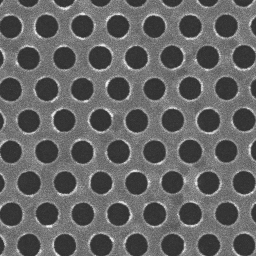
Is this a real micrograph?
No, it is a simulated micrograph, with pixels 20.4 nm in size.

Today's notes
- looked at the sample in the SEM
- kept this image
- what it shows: a regular array of holes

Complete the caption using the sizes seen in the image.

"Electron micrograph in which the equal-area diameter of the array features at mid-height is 474 nm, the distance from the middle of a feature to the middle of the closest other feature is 722 nm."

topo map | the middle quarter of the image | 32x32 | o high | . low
..ooooo....ooooo....ooooo....ooo
oooooooooooooooooooooooooooooooo
oooooooooooooooooooooooooooooooo
oooo.ooooooo...ooooooo.ooooooo..
oo.....oooo.....oooo.....oooo...
oo.....oooo.....oooo.....oooo...
oo.....oooo......ooo.....oooo...
oo.....oooo.....oooo.....oooo...
ooo....ooooo....ooooo...oooooo..
oooooooooooooooooooooooooooooooo
oooooooooooooooooooooooooooooooo
.ooooooo...oooooo..ooooooo...ooo
..ooooo....ooooo....ooooo.....oo
...ooo......oooo.....ooo......oo
...ooo......ooo......ooo......oo
...oooo.....oooo.....oooo.....oo
..oooooo...ooooo....oooooo...ooo
oooooooooooooooooooooooooooooooo
oooooooooooooooooooooooooooooooo
ooo...oooooo...oooooo...oooooo..
oo.....oooo.....oooo.....oooo...
oo......ooo.....oooo.....ooo....
oo......ooo.....oooo......oo....
oo.....oooo.....oooo.....oooo...
ooo...oooooo...oooooo...oooooo..
oooooooooooooooooooooooooooooooo
oooooooooooooooooooooooooooooooo
..oooooo...ooooo....ooooo....ooo
...oooo.....oooo.....ooo......oo
...ooo......ooo......ooo......oo
...oooo.....ooo......ooo......oo
...oooo.....oooo....ooooo....ooo